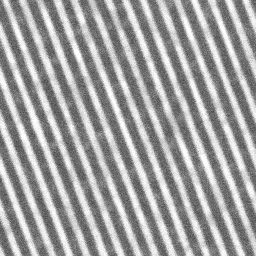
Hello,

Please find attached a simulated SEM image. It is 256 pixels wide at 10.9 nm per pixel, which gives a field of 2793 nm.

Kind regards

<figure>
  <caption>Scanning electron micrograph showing parallel lines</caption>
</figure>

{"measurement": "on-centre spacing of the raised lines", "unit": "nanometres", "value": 175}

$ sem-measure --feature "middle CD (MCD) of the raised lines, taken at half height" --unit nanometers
47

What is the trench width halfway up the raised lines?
121 nanometres